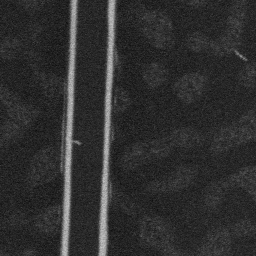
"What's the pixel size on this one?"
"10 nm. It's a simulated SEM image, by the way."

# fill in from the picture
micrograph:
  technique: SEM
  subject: one or a few lines or trenches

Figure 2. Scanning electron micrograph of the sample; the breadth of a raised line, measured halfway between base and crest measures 385 nanometres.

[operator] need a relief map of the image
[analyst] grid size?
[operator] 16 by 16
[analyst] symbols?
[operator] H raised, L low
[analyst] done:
LLLLLHHLLLLLLLLL
LLLLLHHLLLLLLLLL
LLLLLHHLLLLLLLLL
LLLLHHHLLLLLLLLL
LLLLHHHLLLLLLLLL
LLLLHHHLLLLLLLLL
LLLLHHHLLLLLLLLL
LLLLHHHLLLLLLLLL
LLLLHHHLLLLLLLLL
LLLLHHHLLLLLLLLL
LLLLHHHLLLLLLLLL
LLLLHHHLLLLLLLLL
LLLLHHHLLLLLLLLL
LLLLHHHLLLLLLLLL
LLLLHHLLLLLLLLLL
LLLLHHLLLLLLLLLL